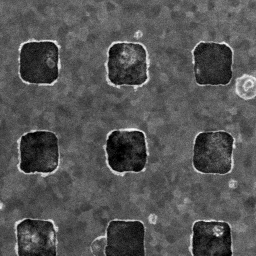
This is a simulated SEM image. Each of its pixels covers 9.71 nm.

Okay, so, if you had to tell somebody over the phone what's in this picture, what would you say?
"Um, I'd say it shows holes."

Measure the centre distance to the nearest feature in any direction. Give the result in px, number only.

87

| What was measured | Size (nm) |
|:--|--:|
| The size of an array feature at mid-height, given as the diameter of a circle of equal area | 427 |